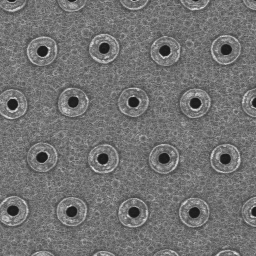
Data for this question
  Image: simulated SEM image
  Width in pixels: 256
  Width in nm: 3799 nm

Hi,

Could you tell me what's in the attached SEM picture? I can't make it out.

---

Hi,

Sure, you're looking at a regular array of ring-shaped raised bodies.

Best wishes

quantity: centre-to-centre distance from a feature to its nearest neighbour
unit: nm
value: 902